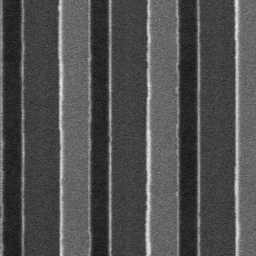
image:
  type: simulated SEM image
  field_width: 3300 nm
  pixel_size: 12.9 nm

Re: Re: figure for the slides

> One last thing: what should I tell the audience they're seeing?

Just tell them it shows lines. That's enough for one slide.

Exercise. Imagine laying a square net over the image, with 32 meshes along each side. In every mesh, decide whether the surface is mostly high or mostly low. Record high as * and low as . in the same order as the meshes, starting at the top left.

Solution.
***....*******.....******.....**
***....*******.....******.....**
***.....******.....******.....**
***.....******.....******.....**
***.....******.....******.....**
***.....******.....******.....**
***.....******.....******.....**
***.....******.....******.....**
***.....******.....******.....**
***.....******.....******.....**
***.....******.....******.....**
***.....******.....******.....**
***.....******.....******.....**
***.....******.....******.....**
***.....******.....******.....**
***.....******.....******.....**
***.....******.....******.....**
***.....******.....******.....**
***.....******.....******.....**
***.....******.....******.....**
***.....******.....******.....**
***.....******.....******.....**
***.....******.....******.....**
***.....******.....******.....**
***.....******.....******.....**
***.....******.....******.....**
***.....******.....******.....**
***.....******.....******.....**
***.....******.....******.....**
***.....******....*******.....**
***.....******.....******.....**
***.....******.....******.....**